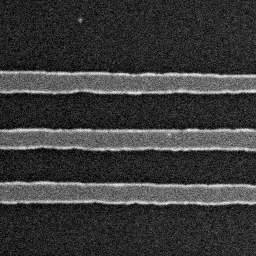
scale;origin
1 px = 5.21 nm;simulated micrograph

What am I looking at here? lines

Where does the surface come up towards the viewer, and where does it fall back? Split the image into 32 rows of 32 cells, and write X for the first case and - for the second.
--------------------------------
--------------------------------
--------------------------------
--------------------------------
--------------------------------
--------------------------------
--------------------------------
--------------------------------
--------------------------------
XXXXXXXXXXXXXXXXXXXXXXXXXXXXXXXX
XXXXXXXXXXXXXXXXXXXXXXXXXXXXXXXX
XX--XXXXX--XXXXXXXXXXX-XXXXX-X--
--------------------------------
--------------------------------
--------------------------------
--------------------------------
XXXXXXXXXXXXXXXXXXXXXXXXXXXXXXXX
XXXXXXXXXXXXXXXXXXXXXXXXXXXXXXXX
XXXXX--XXXXXXXXXXXXXXXXXXXXXXXXX
--------------------------------
--------------------------------
--------------------------------
--------------------------------
XXXXXXXXXXXXXXXXXXXXXXXXXXXXXXXX
XXXXXXXXXXXXXXXXXXXXXXXXXXXXXXXX
--------------------------------
--------------------------------
--------------------------------
--------------------------------
--------------------------------
--------------------------------
--------------------------------